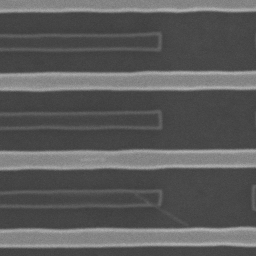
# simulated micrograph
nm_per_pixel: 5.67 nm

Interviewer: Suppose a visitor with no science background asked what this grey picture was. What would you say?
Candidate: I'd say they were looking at wiring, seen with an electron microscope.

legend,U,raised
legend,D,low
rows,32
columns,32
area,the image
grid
UUUUUUUUUUUUUUUUUUUUUUUUUUUUUUUU
DDDDDDDDDDDDDDDDDDDDDDDDDDDDDDDD
DDDDDDDDDDDDDDDDDDDDDDDDDDDDDDDD
DDDDDDDDDDDDDDDDDDDDDDDDDDDDDDDD
UUDUUUUUUUUUUUUUUUUUDDDDDDDDDDDD
UUUUUUUUUUUUUUUUUUUUDDDDDDDDDDDD
DDDDDDDDDDDDDDDDDDDDDDDDDDDDDDDD
DDDDDDDDDDDDDDDDDDDDDDDDDDDDDDDD
DDDDDDDDDDDDDDDDDDDDDDDDDDDDDDDD
UUUUUUUUUUUUUUUUUUUUUUUUUUUUUUUU
UUUUUUUUUUUUUUUUUUUUUUUUUUUUUUUU
DDDDDDDDDDDDDDDDDDDDDDDDDDDDDDDD
DDDDDDDDDDDDDDDDDDDDDDDDDDDDDDDD
DDDDDDDDDDDDDDDDDDDDDDDDDDDDDDDD
UUUUUUUUUUUUUUUUUUUUDDDDDDDDDDDD
UUUUUUUUUUUUUUUUUUUUDDDDDDDDDDDD
DDDDDDDDDDDDDDDDDDDDDDDDDDDDDDDD
DDDDDDDDDDDDDDDDDDDDDDDDDDDDDDDD
DDDDDDDDDDDDDDDDDDDDDDDDDDDDDDDD
UUUUUUUUUUUUUUUUUUUUUUUUUUUUUUUU
UUUUUUUUUUUUUUUUUUUUUUUUUUUUUUUU
DDDDDDDDDDDDDDDDDDDDDDDDDDDDDDDD
DDDDDDDDDDDDDDDDDDDDDDDDDDDDDDDD
DDDDDDDDDDDDDDDDDDDDDDDDDDDDDDDD
UUUUUUUUUUUUUUUUUUUUDDDDDDDDDDDD
UUUUUUUUUUUUUUUUUUUUDDDDDDDDDDDD
DDDDDDDDDDDDDDDDDDDDDDDDDDDDDDDD
DDDDDDDDDDDDDDDDDDDDDDDDDDDDDDDD
DDDDDDDDDDDDDDDDDDDDDDDDDDDDDDDD
UUUUUUUUUUUUUUUUUUUUUUUUUUUUUUUU
UUUUUUUUUUUUUUUUUUUUUUUUUUUUUUUU
DDDDDDDDDDDDDDDDDDDDDDDDDDDDDDDD